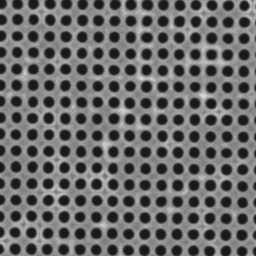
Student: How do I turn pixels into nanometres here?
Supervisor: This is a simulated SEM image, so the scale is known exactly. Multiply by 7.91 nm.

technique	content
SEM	a regular array of holes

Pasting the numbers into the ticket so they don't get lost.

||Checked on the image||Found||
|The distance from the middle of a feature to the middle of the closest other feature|127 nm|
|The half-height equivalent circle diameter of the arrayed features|0.0861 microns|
